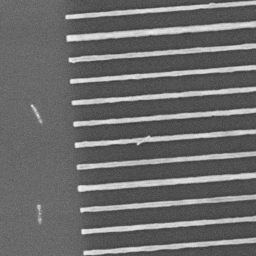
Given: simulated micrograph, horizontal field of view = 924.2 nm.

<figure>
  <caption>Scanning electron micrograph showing parallel lines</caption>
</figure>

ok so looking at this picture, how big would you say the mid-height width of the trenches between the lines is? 64.2 nanometres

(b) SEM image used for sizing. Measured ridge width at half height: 15.3 nm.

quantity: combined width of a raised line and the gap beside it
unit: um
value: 0.0777